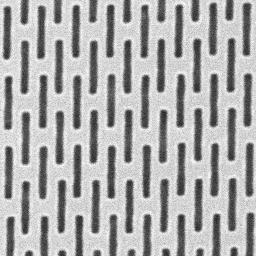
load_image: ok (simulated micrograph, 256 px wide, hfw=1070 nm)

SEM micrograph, a regular array of holes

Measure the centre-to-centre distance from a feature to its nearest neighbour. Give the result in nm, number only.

142